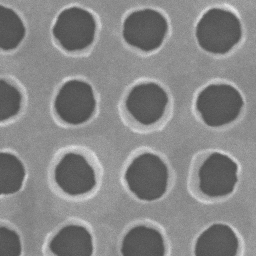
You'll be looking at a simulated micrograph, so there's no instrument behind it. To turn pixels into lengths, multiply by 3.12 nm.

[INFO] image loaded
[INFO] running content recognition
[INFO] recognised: a regular array of holes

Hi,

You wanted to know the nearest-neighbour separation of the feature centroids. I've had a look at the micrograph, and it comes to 219 nanometers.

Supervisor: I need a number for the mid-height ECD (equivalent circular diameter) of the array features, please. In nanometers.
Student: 144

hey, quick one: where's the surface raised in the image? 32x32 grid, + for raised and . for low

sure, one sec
++++++++++++++++++++++++++++++++
..++++++...+++++....++++++...+++
...++++.....++++.....++++.....++
...++++.....+++......+++.......+
...++++.....+++......+++......++
...++++.....++++....+++++.....++
++++++++..+++++++..+++++++...+++
++++++++++++++++++++++++++++++++
++++++++++++++++++++++++++++++++
++++++++++++++++++++++++++++++++
..++++++...++++++...++++++++++++
...++++.....++++.....++++.....++
...++++.....+++......++++.....++
...++++.....+++......+++.......+
...++++.....++++....+++++.....++
+++++++++.+++++++..+++++++...+++
++++++++++++++++++++++++++++++++
++++++++++++++++++++++++++++++++
++++++++++++++++++++++++++++++++
..+++++....++++++...+++++...++++
...++++....+++++.....++++....+++
...+++......++++.....+++......++
...++++.....++++.....+++......++
...++++.....++++.....+++.....+++
+++++++++..++++++...+++++....+++
++++++++++++++++++++++++++++++++
++++++++++++++++++++++++++++++++
++++++++++++++++++++++++++++++++
..+++++....+++++....++++++...+++
...+++.....++++.....+++++.....++
...+++......+++......+++......++
...+++......+++......+++......++